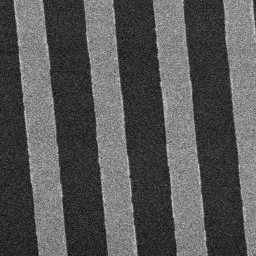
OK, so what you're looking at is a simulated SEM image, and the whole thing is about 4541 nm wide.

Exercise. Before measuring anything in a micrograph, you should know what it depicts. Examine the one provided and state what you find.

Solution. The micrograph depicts one or a few lines or trenches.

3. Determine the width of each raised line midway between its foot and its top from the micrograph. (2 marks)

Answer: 28.5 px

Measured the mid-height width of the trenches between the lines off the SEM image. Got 720 nm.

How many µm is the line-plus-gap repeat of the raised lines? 1.23